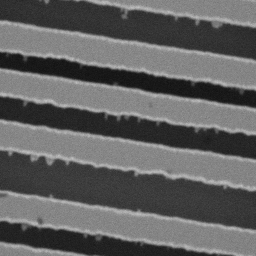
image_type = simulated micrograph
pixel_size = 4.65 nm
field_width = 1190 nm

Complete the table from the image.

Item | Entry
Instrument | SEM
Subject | lines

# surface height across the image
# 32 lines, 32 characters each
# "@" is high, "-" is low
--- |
------------@@@@@@@@@@@@@@@@@@@@
-------------------@@@@@@@@@@@@@
--------------------------@@@@@@
@@@@@@--------------------------
@@@@@@@@@@@@--------------------
@@@@@@@@@@@@@@@@@@@-------------
@@@@@@@@@@@@@@@@@@@@@@@@@-------
--------@@@@@@@@@@@@@@@@@@@@@@@@
-------------@@@@@@@@@@@@@@@@@@@
@@@@@@@-------------@@@@@@@@@@@@
@@@@@@@@@@@@@--------------@@@@@
@@@@@@@@@@@@@@@@@@@-------------
---@@@@@@@@@@@@@@@@@@@@@@@------
---------@@@@@@@@@@@@@@@@@@@@@@@
-----------------@@@@@@@@@@@@@@@
@@@------------------@@@@@@@@@@@
@@@@@@@@@@------------------@@@@
@@@@@@@@@@@@@@@@----------------
@@@@@@@@@@@@@@@@@@@@@@@---------
-----@@@@@@@@@@@@@@@@@@@@@@@@---
-----------@@@@@@@@@@@@@@@@@@@@@
-----------------@@@@@@@@@@@@@@@
------------------------@@@@@@@@
-----------------------------@@@
@@@@@---------------------------
@@@@@@@@@@@---------------------
@@@@@@@@@@@@@@@@@---------------
@@@@@@@@@@@@@@@@@@@@@@@@--------
------@@@@@@@@@@@@@@@@@@@@@@@@--
-------------@@@@@@@@@@@@@@@@@@@
@@-----------------@@@@@@@@@@@@@
@@@@@@@@----------------@@@@@@@@